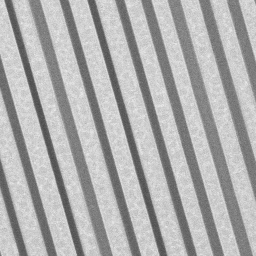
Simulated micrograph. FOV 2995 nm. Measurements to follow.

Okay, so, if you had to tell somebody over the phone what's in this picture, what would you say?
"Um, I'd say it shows parallel lines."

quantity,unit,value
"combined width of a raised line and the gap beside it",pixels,26.9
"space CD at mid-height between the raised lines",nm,114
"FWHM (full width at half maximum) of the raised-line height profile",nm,205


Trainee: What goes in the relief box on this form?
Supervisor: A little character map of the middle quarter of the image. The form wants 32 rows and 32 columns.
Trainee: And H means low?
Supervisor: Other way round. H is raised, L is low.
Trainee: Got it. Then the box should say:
HHHHLLHHHHLLHHHHHHLLHHHHLLLHHHLL
HHHHLLHHHHHLLHHHHHLLHHHHLLLHHHHL
HHHHLLHHHHHLLHHHHHLLHHHHLLLHHHHL
HHHHLLLHHHHLLHHHHHLLLHHHHLLLHHHL
HHHHHLLHHHHHLLHHHHHLLHHHHLLLHHHH
HHHHHLLHHHHHLLHHHHHLLHHHHLLLHHHH
LHHHHLLLHHHHLLHHHHHLLLHHHHLLHHHH
LHHHHHLLHHHHLLHHHHHHLLHHHHLLLHHH
LHHHHHLLHHHHHLLHHHHHLLHHHHLLLHHH
LHHHHHLLHHHHHLLHHHHHLLHHHHLLLHHH
LLHHHHLLLHHHHLLHHHHHLLLHHHHLLLHH
LLHHHHHLLHHHHHLLHHHHHLLHHHHLLLHH
LLHHHHHLLHHHHHLLHHHHHLLHHHHLLLHH
LLLHHHHLLLHHHHLLHHHHHLLLHHHHLLHH
LLLHHHHHLLHHHHLLHHHHHHLLHHHHLLLH
LLLHHHHHLLHHHHHLLHHHHHLLHHHHLLLH
LLLHHHHHLLHHHHHLLHHHHHLLHHHHLLLH
HLLLHHHHLLLHHHHLLHHHHHLLLHHHHLLH
HLLLHHHHHLLHHHHHLLHHHHHLLHHHHLLL
HLLLHHHHHLLHHHHHLLHHHHHLLHHHHLLL
HLLLLHHHHLLLHHHHLLHHHHHLLHHHHHLL
HHLLLHHHHHLLHHHHLLHHHHHLLLHHHHLL
HHLLLHHHHHLLHHHHHLLHHHHHLLHHHHLL
HHLLLHHHHHLLHHHHHLLHHHHHLLHHHHLL
HHHLLLHHHHLLLHHHHLLHHHHHLLLHHHHL
HHHLLLHHHHHLLHHHHHLHHHHHHLLHHHHL
HHHLLLHHHHHLLHHHHHLLHHHHHLLHHHHL
HHHLLLLHHHHLLLHHHHLLHHHHHLLLHHHH
HHHHLLLHHHHHLLHHHHLLHHHHHLLLHHHH
HHHHLLLHHHHHLLHHHHHLLHHHHHLLHHHH
HHHHLLLHHHHHLLHHHHHLLHHHHHLLHHHH
HHHHHLLLHHHHLLLHHHHLLHHHHHLLLHHH